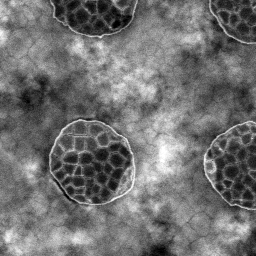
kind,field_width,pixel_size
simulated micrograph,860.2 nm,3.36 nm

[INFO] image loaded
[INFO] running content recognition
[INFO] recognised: raised bodies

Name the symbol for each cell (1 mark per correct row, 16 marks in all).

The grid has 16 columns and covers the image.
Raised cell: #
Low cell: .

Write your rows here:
...#####.....###
....####......##
...............#
................
................
................
................
................
....####......##
...#####.....###
...#####.....###
....####.....###
.....##.......##
................
................
................